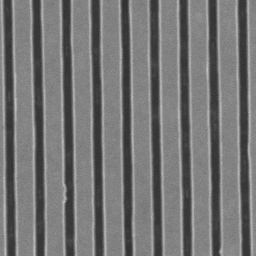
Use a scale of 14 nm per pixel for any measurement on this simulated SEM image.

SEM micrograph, parallel lines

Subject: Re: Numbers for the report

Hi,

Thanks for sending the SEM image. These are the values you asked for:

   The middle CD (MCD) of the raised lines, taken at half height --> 0.283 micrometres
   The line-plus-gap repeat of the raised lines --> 29.3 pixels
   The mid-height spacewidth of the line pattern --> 124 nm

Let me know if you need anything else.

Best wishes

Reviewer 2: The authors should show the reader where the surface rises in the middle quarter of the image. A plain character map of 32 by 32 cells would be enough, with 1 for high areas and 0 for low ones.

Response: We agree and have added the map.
00111110011111000111100011111001
00111110011111000111100011111001
00111110011111000111110011111001
00111110011111000111110011111001
00111110011111000111110011111001
00111110011111000111110011111000
00111110011111000111110011111000
00111110011111100111110011111000
00111110011111000111110011111000
00111110011111000111110011111000
00111110001111000111110011111001
00111110001111000111110011111001
00111110001111100111110011111001
00111110001111100111110011111000
00011110001111100111110011111000
00011110001111000111110011111000
00011110001111000111110011111000
00011110001111000111110011111000
00011110001111000111110011111000
00011110001111000111110011111000
00011110001111000111110011111000
00011110001111100111110011111000
00111110001111100111110011111000
00111110001111100111110011111000
00111110001111100111110011111000
00111110001111100111110011111000
00111110001111100111110011111000
00011110001111100111110011111000
00011110001111100111110011111000
00011110001111100111110011111000
00011110001111100111110011111000
10011110001111100111110011111000